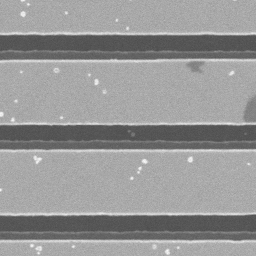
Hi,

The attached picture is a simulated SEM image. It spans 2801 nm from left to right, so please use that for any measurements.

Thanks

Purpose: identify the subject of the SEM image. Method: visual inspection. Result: lines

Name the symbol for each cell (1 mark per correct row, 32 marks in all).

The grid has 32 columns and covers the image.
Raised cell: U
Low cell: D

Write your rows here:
UUUUUUUUUUUUUUUUUUUUUUUUUUUUUUUU
UUUUUUUUUUUUUUUUUUUUUUUUUUUUUUUU
UUUUUUUUUUUUUUUUUUUUUUUUUUUUUUUU
UUUUUUUUUUUUUUUUUUUUUUUUUUUUUUUU
DDDDDDDDDDDDDDDDDDDDDDDDDDDDDDDD
DDDDDDDDDDDDDDDDDDDDDDDDDDDDDDDD
DDDDDDDDDDDDDDDDDDDDDDDDDDDDDDDD
DDDDDDDDDDDDDDDDDDDDUUUUUUUUUUUU
UUUUUUUUUUUUUUUUUUUUUUUUUUUUUUUU
UUUUUUUUUUUUUUUUUUUUUUUUUUUUUUUU
UUUUUUUUUUUUUUUUUUUUUUUUUUUUUUUU
UUUUUUUUUUUUUUUUUUUUUUUUUUUUUUUU
UUUUUUUUUUUUUUUUUUUUUUUUUUUUUUUU
UUUUUUUUUUUUUUUUUUUUUUUUUUUUUUUU
UUUUUUUUUUUUUUUUUUUUUUUUUUUUUUUU
UUUUUUUUUUUUUUUUUUUUUUUUUUUUUUUU
DDDDDDDDDDDDDDDDDDDDDDDDDDDDDDDD
DDDDDDDDDDDDDDDDDDDDDDDDDDDDDDDD
DDDDDDDDDDDDDDDDDDDDDDDDDDDDDDDD
UUUUUUUUUUUUUUUUUUUUUUUUUUUUUUUU
UUUUUUUUUUUUUUUUUUUUUUUUUUUUUUUU
UUUUUUUUUUUUUUUUUUUUUUUUUUUUUUUU
UUUUUUUUUUUUUUUUUUUUUUUUUUUUUUUU
UUUUUUUUUUUUUUUUUUUUUUUUUUUUUUUU
UUUUUUUUUUUUUUUUUUUUUUUUUUUUUUUU
UUUUUUUUUUUUUUUUUUUUUUUUUUUUUUUU
UUUUUUUUUUUUUUUUUUUUUUUUUUUUUUUU
DDDDDDDDDDDDDDDDDDDDDDDDDDDDDDDD
DDDDDDDDDDDDDDDDDDDDDDDDDDDDDDDD
DDDDDDDDDDDDDDDDDDDDDDDDDDDDDDDD
UUUUUUUUUUUUUUUUUUUUUUUUUUUUUUUU
UUUUUUUUUUUUUUUUUUUUUUUUUUUUUUUU